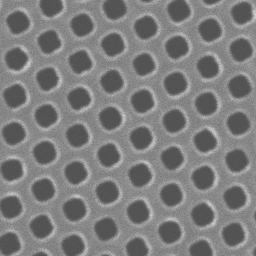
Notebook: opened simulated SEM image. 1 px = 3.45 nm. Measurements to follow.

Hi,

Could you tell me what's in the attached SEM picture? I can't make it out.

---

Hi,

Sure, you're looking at a regular array of holes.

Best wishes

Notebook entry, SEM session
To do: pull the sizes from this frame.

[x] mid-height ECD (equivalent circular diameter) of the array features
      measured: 79.5 nanometers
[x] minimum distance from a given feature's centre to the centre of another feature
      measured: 0.126 um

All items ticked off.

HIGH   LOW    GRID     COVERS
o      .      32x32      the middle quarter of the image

o......oooooooooo......ooooooooo
oo....oooooooooooo.....ooooooooo
oooooooooo....oooo...ooooo...ooo
ooooooooo......oooooooooo.....oo
ooooooooo......oooooooooo......o
ooooooooo......oooooooooo......o
oo....oooo....ooooo..ooooo....oo
o.....ooooooooooo.....oooo...ooo
o......oooooooooo.....oooooooooo
o......oooooooooo......ooooooooo
oo....ooooooooooo.....oooooooooo
ooo.oooooo....oooo...oooooo..ooo
ooooooooo.....ooooooooooo.....oo
ooooooooo......oooooooooo.....oo
ooooooooo......oooooooooo......o
oo...oooo.....ooooooooooo.....oo
o.....ooooo.ooooo....ooooo...ooo
......ooooooooooo.....oooooooooo
o.....oooooooooo......oooooooooo
o.....ooooooooooo.....oooooooooo
oo..oooooo...oooo....oooooo.oooo
ooooooooo....oooooooooooo....ooo
oooooooo......oooooooooo......oo
oooooooo......oooooooooo......oo
oo..ooooo.....oooooooooo......oo
o....ooooo..ooooo....oooo....ooo
......oooooooooo.....ooooo.ooooo
......oooooooooo......oooooooooo
o.....oooooooooo......oooooooooo
o...oooooo..ooooo....ooooooooooo
oooooooo.....ooooo..ooooo....ooo
oooooooo......oooooooooo.....ooo